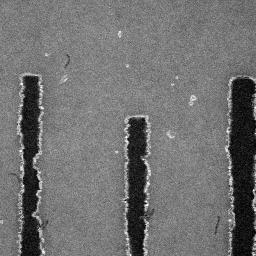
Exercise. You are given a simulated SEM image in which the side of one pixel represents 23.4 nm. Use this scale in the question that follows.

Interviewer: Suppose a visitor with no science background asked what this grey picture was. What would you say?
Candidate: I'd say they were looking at one or a few lines or trenches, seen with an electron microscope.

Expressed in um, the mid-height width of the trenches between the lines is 2.02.